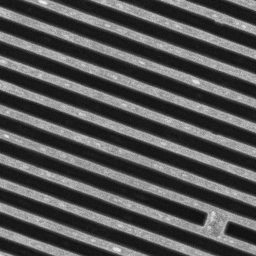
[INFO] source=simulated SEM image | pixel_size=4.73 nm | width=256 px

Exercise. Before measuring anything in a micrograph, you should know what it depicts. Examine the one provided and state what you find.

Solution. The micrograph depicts parallel lines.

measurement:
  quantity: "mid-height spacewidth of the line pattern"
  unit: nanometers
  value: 63.9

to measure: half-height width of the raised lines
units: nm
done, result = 45.6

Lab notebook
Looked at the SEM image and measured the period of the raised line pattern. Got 109 nm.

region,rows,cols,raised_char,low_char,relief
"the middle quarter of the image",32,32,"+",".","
.++++++++.........++++++++......
....+++++++..........+++++++....
......++++++++..........+++++++.
.........++++++++..........+++++
+++.........++++++++.........+++
+++++..........+++++++..........
.+++++++.........++++++++.......
....+++++++.........+++++++.....
.......+++++++.........++++++++.
.........+++++++..........++++++
++..........+++++++..........+++
+++++..........+++++++..........
.+++++++..........+++++++.......
...+++++++..........++++++++....
......+++++++..........+++++++..
.........+++++++..........++++++
++..........+++++++..........+++
++++..........++++++++..........
+++++++..........+++++++........
...++++++++.........+++++++.....
......+++++++..........+++++++..
........++++++++..........++++++
++.........+++++++..........++++
+++++.........+++++++..........+
+++++++..........+++++++........
..++++++++..........+++++++.....
.....+++++++...........++++++...
........+++++++..........+++++++
+..........+++++++..........++++
++++..........+++++++..........+
+++++++.........+++++++.........
...+++++++.........++++++++.....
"